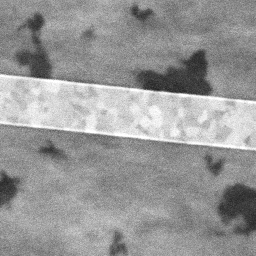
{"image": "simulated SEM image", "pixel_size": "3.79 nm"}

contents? one or a few lines or trenches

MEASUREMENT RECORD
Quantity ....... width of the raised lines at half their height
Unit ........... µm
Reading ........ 0.178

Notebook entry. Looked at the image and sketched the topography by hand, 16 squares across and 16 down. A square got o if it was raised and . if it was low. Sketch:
................
................
................
................
................
ooooooo.........
oooooooooooooooo
oooooooooooooooo
........oooooooo
................
................
................
................
................
................
................